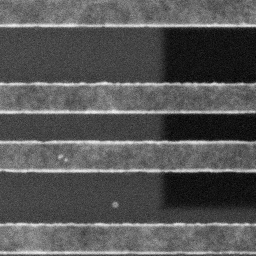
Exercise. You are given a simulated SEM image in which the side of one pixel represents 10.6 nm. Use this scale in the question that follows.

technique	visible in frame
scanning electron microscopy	lines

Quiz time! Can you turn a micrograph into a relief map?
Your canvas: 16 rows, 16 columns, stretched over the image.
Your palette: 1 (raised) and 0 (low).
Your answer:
1111111111111111
1111111111111111
0000000000000000
0000000000000000
0000000000000000
1111111111111111
1111111111111111
0000000000000000
0000000000000000
1111111111111111
1111111111111111
0000000000000000
0000000000000000
0000000000000000
1111111111111111
1111111111111111